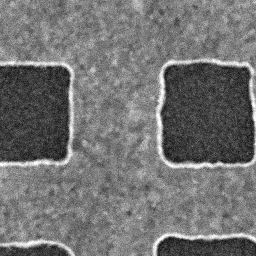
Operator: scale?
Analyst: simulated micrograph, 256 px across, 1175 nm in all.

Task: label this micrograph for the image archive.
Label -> holes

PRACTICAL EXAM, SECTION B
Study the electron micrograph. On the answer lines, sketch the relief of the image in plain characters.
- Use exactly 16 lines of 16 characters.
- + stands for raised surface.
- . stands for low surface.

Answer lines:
++++++++++++++++
++++++++++++++++
++++++++++++++++
++++++++++++++++
....++++++......
....++++++......
....++++++......
....++++++......
....++++++......
....++++++......
++++++++++++++++
++++++++++++++++
++++++++++++++++
++++++++++++++++
++++++++++++++++
....++++++......